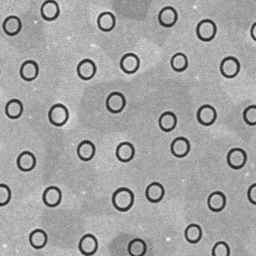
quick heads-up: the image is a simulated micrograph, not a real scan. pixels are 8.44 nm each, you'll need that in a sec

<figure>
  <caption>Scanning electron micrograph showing a regular array of ring-shaped grooves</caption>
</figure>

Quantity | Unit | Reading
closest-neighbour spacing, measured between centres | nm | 352